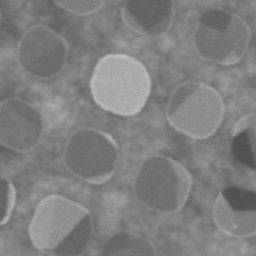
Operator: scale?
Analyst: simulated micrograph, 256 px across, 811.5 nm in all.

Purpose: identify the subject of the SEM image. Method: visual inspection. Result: raised bodies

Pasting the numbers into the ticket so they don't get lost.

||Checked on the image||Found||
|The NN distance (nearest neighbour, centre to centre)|244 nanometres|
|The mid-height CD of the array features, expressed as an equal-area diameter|0.178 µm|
